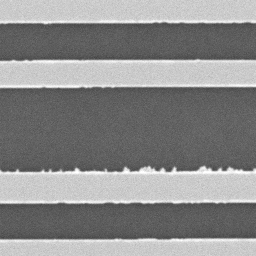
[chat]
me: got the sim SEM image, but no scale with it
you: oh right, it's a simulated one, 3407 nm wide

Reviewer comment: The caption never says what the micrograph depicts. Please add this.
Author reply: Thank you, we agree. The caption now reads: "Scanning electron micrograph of lines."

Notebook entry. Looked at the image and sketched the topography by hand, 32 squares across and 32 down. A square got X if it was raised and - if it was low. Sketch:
XXXXXXXXXXXXXXXXXXXXXXXXXXXXXXXX
XXXXXXXXXXXXXXXXXXXXXXXXXXXXXXXX
XXXXXXXXXXXXXXXXXXXXXXXXXXXXXXXX
--------------------------------
--------------------------------
--------------------------------
--------------------------------
------------------------X-------
XXXXXXXXXXXXXXXXXXXXXXXXXXXXXXXX
XXXXXXXXXXXXXXXXXXXXXXXXXXXXXXXX
XXXXXXXXXXXXXXXXXXXXXXXXXXXXXXXX
--------------------------------
--------------------------------
--------------------------------
--------------------------------
--------------------------------
--------------------------------
--------------------------------
--------------------------------
--------------------------------
--------------------------------
--------XXXXX-XXXXXXXXXXXXXXXXXX
XXXXXXXXXXXXXXXXXXXXXXXXXXXXXXXX
XXXXXXXXXXXXXXXXXXXXXXXXXXXXXXXX
XXXXXXXXXXXXXXXXXXXXXXXXXXXXXXXX
--------------------------------
--------------------------------
--------------------------------
--------------------------------
--------------------------------
XXXXXXXXXXXXXXXXXXXXXXXXXXXXXXXX
XXXXXXXXXXXXXXXXXXXXXXXXXXXXXXXX